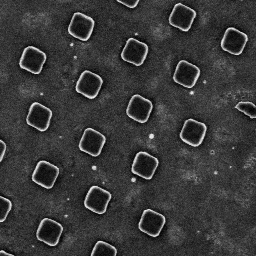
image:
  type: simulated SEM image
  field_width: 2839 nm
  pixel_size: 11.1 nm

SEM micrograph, a regular array of raised bodies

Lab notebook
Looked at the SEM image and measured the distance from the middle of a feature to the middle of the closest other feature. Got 633 nanometers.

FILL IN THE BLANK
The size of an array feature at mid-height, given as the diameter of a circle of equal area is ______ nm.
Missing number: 278